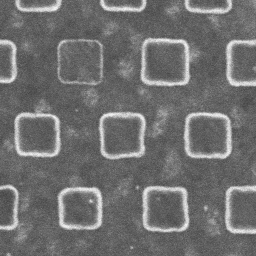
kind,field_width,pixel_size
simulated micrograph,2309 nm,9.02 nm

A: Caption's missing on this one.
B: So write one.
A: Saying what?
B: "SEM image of raised bodies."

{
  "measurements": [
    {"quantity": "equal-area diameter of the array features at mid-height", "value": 46.5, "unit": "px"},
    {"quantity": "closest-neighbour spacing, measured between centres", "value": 764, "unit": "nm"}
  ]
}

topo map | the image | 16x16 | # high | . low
.##....##...##..
................
................
#........###..##
#........###..##
................
................
.##...###...##..
.###..###...##..
.##....##...##..
................
................
#...##...###..##
#...##...###..##
...............#
................